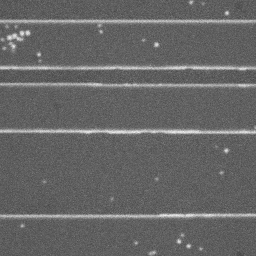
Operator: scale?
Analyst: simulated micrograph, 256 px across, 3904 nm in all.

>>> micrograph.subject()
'lines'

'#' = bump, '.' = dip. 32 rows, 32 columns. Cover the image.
................................
................................
................................
################################
################################
################################
################################
################################
##############.########.########
................................
................................
################################
################################
################################
################################
################################
...........#..####...###########
................................
................................
................................
................................
................................
................................
................................
................................
................................
................................
################################
################################
################################
################################
################################